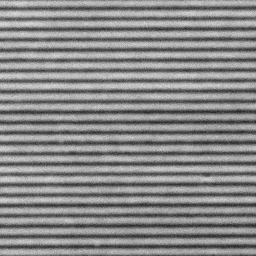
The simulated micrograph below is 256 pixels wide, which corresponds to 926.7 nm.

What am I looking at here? parallel lines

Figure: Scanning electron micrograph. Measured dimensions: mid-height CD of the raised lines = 20.8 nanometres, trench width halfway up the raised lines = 17.2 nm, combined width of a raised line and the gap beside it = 10.4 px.